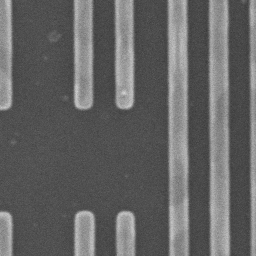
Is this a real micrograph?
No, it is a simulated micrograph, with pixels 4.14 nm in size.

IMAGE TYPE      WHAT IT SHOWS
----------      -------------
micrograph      wiring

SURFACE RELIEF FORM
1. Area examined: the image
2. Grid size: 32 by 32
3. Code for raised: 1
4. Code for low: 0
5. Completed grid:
10000000011000111000011000110001
10000000011000011000011000110001
10000000011000011000011000110001
10000000011000011000011000110001
10000000011000011000011000110001
10000000011000011000011000110001
10000000011000011000011000110001
10000000011000011000011000110001
10000000011000011000011000110001
10000000011000011000011000110001
10000000011000011000011000110001
10000000011000011000011000110001
10000000011000011000011000110001
10000000001000010000011000110001
00000000000000000000011000110001
00000000000000000000011000110001
00000000000000000000011000110001
00000000000000000000011000110001
00000000000000000000011000110001
00000000000000000000011000110001
00000000000000000000011000110001
00000000000000000000011000111001
00000000000000000000011000111001
00000000000000000000011000111001
00000000000000000000011000111001
00000000000000000000011000111000
00000000001000010000011000111000
10000000011100011000011000111000
10000000011100011000011000111000
10000000011100011000011000111000
10000000011100011000011000111000
10000000011100011000011000111000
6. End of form